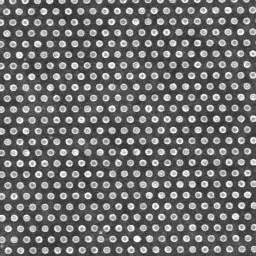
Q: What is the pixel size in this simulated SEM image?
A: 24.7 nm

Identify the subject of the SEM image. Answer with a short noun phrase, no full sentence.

a regular array of raised bodies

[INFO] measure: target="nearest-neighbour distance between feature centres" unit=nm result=302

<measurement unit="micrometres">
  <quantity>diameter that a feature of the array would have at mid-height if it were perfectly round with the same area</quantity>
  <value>0.153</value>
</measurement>